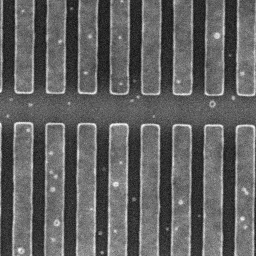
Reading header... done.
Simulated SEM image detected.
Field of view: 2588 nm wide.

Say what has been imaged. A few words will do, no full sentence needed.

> groups of lines, slits or small figures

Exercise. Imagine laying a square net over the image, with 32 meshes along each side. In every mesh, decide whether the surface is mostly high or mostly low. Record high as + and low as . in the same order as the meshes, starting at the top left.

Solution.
..++..++..++..++..++..++..++..++
..++..++..++..++..++..++..++..++
..++..++..++..++..++..++..++..++
..++..++..++..++..++..++..++..++
..++..++..++..++..++..++..++..++
..++..++..++..++..++..++..++..++
..++..++..++..++..++..++..++..++
..++..++..++..++..++..++..++..++
..++..++..++..++..++..++..++..++
..++..++..++..++..++..++..++..++
..++..++..++..++..++..++..++..++
..++..++..++..++..++..++..++..++
................................
................................
................................
..++..++..+.....................
..++..++..++..++..++..++..++..++
..++..++..++..++..++..++..++..++
..++..++..++..++..++..++..++..++
..++..++..++..++..++..++..++..++
..++..++..++..++..++..++..++..++
..++..++..++..++..++..++..++..++
..++..++..++..++..++..++..++..++
..++..++..++..++..++..++..++..++
..++..++..++..++..++..++..++..++
..++..++..++..++..++..++..++..++
..++..++..++..++..++..++..++..++
..++..++..++..++..++..++..++..++
..++..++..++..++..++..++..++..++
..++..++..++..++..++..++..++.+++
..++..++..++..++..++..++.+++.+++
..++..++..++..++..++..++.+++.+++